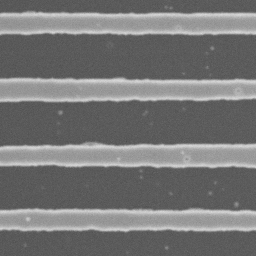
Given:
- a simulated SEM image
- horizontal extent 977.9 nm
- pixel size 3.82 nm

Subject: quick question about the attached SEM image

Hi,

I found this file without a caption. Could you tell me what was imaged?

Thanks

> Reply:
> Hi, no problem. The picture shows lines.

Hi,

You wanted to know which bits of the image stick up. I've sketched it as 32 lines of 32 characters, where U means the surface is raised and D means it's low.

DDDDDDDDDDDDDDDDDDDDDDDDDDDDDDDD
DDDDDDDDDDDDDDDDDDDDDDDDDDDDDDDD
UUUUUUUUUUUUUUUUUUUUUUUUUUUUUUUU
UUUUUUUUUUUUUUUUUUUUUUUUUUUUUUUU
DDDDDDDDDDDDDDDDDDDDDDDDDDDDDDDD
DDDDDDDDDDDDDDDDDDDDDDDDDDDDDDDD
DDDDDDDDDDDDDDDDDDDDDDDDDDDDDDDD
DDDDDDDDDDDDDDDDDDDDDDDDDDDDDDDD
DDDDDDDDDDDDDDDDDDDDDDDDDDDDDDDD
DDDDDDDDDDDDDDDDDDDDDDDDDDDDDDDD
UUUUUUUUUUUUUUUUUUUUUUUUUUUUUUUU
UUUUUUUUUUUUUUUUUUUUUUUUUUUUUUUU
UUUUUUUUUUUUUUUUUUUUDDDDUUDDDDDD
DDDDDDDDDDDDDDDDDDDDDDDDDDDDDDDD
DDDDDDDDDDDDDDDDDDDDDDDDDDDDDDDD
DDDDDDDDDDDDDDDDDDDDDDDDDDDDDDDD
DDDDDDDDDDDDDDDDDDDDDDDDDDDDDDDD
DDDDDDDDDDDDDDDDDDDDDDDDDDDDDDDD
UUUUUUUUUUUUUUUUUUUUUUUUUUUUUUUU
UUUUUUUUUUUUUUUUUUUUUUUUUUUUUUUU
UUUUUUUUUUUUUUUUUUUUUUUUUUUUUUUU
DDDDDDDDDDDDDDDDDDDDDDDDDDDDDDDD
DDDDDDDDDDDDDDDDDDDDDDDDDDDDDDDD
DDDDDDDDDDDDDDDDDDDDDDDDDDDDDDDD
DDDDDDDDDDDDDDDDDDDDDDDDDDDDDDDD
DDDDDDDDDDDDDDDDDDDDDDDDDDDDDDDD
UUUUUUUUUUUUUUUUUUUUUUUUUUUUUUUU
UUUUUUUUUUUUUUUUUUUUUUUUUUUUUUUU
UUUUUUUUUUUUUUUUUUUUUUUUUUUUUUUU
DDDDDDDDDDDDDDDDDDDDDDDDDDDDDDDD
DDDDDDDDDDDDDDDDDDDDDDDDDDDDDDDD
DDDDDDDDDDDDDDDDDDDDDDDDDDDDDDDD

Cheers